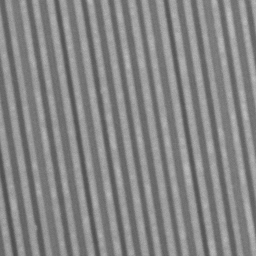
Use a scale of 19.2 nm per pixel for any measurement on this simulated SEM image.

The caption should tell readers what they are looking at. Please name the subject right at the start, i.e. parallel lines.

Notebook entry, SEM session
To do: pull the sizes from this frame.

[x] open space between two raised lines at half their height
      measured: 121 nanometers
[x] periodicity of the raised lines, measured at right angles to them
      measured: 13.5 px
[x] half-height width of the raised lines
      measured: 121 nm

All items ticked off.